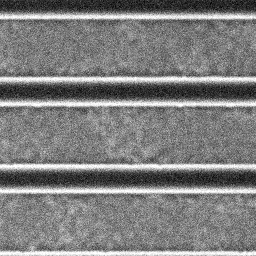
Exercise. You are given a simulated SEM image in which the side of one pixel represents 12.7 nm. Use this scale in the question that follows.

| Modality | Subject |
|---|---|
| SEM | lines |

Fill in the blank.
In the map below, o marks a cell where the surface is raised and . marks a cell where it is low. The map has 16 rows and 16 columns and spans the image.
oooooooooooooooo
................
................
................
................
oooooooooooooooo
oooooooooooooooo
................
................
................
oooooooooooooooo
oooooooooooooooo
................
................
................
................